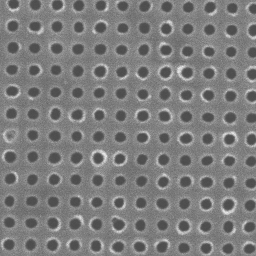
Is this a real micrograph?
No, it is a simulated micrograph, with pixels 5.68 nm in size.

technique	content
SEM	a regular array of holes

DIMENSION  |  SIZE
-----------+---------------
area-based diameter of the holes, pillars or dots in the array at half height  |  57.7 nm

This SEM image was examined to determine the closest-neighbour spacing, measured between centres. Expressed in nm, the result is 122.